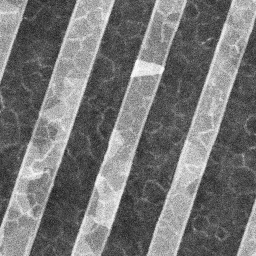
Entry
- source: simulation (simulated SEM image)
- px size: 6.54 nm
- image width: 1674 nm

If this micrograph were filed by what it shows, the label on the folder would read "one or a few lines or trenches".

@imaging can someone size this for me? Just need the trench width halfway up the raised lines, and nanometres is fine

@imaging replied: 295